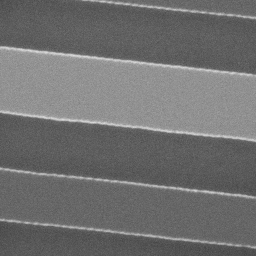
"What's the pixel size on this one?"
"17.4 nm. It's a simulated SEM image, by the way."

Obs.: lines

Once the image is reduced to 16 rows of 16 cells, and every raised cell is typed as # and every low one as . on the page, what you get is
..........######
................
................
#####...........
##############..
################
################
....############
.............###
................
................
#########.......
################
################
.......#########
................